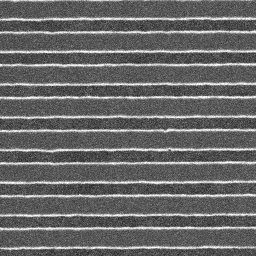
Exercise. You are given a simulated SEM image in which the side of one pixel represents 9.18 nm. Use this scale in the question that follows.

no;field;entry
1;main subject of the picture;parallel lines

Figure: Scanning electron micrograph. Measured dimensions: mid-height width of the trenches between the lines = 0.116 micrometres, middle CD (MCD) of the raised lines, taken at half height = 182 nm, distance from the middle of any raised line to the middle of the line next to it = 300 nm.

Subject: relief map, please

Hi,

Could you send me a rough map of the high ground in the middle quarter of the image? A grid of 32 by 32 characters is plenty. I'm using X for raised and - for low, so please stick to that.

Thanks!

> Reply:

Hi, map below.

XXXXXXXXXXXXXXXXXXXXXXXXXXXXXXXX
XXXXXXXXXXXXXXXXXXXXXXXXXXXXXXXX
XXXXXXXXXXXXXXXXXXXXXXXXXXXXXXXX
XXXXXXXXXXXXXXXXXXXXXXXXXXXXXXXX
XXXXXXXXXXXXXXXXXXXXXXXXXXXXXXXX
--------------------------------
--------------------------------
--------------------------------
XXX-XXXXX-XXXXXX---X-XXXXXXXXXXX
XXXXXXXXXXXXXXXXXXXXXXXXXXXXXXXX
XXXXXXXXXXXXXXXXXXXXXXXXXXXXXXXX
XXXXXXXXXXXXXXXXXXXXXXXXXXXXXXXX
XXXXXXXXXXXXXXXXXXXXXXXXXXXXXXXX
--------------------------------
--------------------------------
--------------------------------
---------XX-----XX---------X----
XXXXXXXXXXXXXXXXXXXXXXXXXXXXXXXX
XXXXXXXXXXXXXXXXXXXXXXXXXXXXXXXX
XXXXXXXXXXXXXXXXXXXXXXXXXXXXXXXX
XXXXXXXXXXXXXXXXXXXXXXXXXXXXXXXX
-----------XX------X---XXX------
--------------------------------
--------------------------------
--------------------------------
XXXXXXXXXXXXXXXXXXXXXXXXXXXXXXXX
XXXXXXXXXXXXXXXXXXXXXXXXXXXXXXXX
XXXXXXXXXXXXXXXXXXXXXXXXXXXXXXXX
XXXXXXXXXXXXXXXXXXXXXXXXXXXXXXXX
XXXXXXXXXXXXXXXXXXX-XXXXXXXXXXX-
--------------------------------
--------------------------------